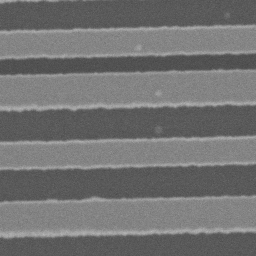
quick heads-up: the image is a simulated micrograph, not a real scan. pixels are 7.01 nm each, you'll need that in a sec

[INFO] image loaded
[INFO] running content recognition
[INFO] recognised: lines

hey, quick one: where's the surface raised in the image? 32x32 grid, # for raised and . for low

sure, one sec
................................
................................
................................
.................##.############
################################
################################
################################
................................
................................
################################
################################
################################
################################
############....................
................................
................................
................................
.............###################
################################
################################
################################
................................
................................
................................
................................
################################
################################
################################
################################
###.###.........................
................................
................................